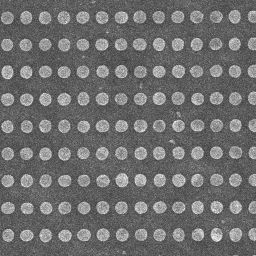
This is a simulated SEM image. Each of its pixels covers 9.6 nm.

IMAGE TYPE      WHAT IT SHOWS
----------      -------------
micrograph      a regular array of raised bodies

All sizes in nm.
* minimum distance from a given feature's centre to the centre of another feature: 180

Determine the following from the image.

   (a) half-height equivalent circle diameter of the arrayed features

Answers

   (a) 118 nanometres